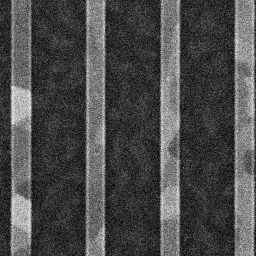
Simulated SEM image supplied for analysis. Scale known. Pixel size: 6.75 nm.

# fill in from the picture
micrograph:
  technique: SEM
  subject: one or a few lines or trenches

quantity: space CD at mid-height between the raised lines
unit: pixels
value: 57.7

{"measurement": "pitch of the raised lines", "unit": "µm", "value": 0.502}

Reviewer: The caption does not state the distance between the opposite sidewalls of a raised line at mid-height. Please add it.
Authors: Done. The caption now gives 115 nanometers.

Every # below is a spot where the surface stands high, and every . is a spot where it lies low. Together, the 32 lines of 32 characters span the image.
..##.......##.......##........##
..##.......##.......##........##
..##.......##.......##........##
..##.......##.......##........##
..##.......##.......##........##
..##.......##.......##........##
..##.......##.......##........##
..##.......##.......##........##
..##.......##.......##........##
..##.......##.......##........##
..##.......##.......##........##
..##.......##.......##........##
..##.......##.......##........##
..##.......##.......##........##
..##.......##.......##........##
..##.......##.......##........##
..##.......##.......##........##
..##.......##.......##........##
..##.......##.......##........##
..##.......##.......##........##
..##.......##.......##........##
..##.......##.......##........##
..##.......##.......##........##
..##.......##.......##........##
..##.......##.......##........##
..##.......##.......##........##
..##.......##.......##........##
..##.......##.......##........##
..##.......##.......##........##
..##.......##.......##........##
..##.......##.......##........##
..##.......##.......##........##